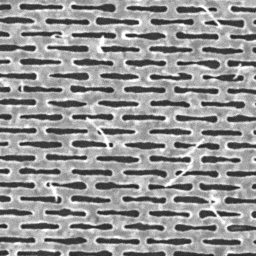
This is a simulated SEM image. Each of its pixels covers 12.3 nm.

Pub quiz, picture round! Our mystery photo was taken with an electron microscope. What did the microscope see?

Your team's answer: a regular array of holes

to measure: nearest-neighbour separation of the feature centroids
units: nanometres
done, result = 326